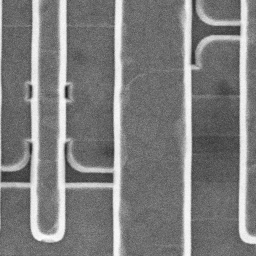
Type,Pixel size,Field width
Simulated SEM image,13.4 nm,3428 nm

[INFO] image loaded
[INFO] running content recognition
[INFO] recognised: wiring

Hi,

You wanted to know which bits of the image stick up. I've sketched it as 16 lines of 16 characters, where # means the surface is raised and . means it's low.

..##...#####...#
..##...#####...#
..##...#####...#
..##...#####...#
..##...#####...#
..##...#####...#
..##...#####...#
..##...#####...#
..##...#####...#
..##...#####...#
..##...#####...#
..##...#####...#
..##...#####...#
..##...#####...#
..##...#####...#
.......#####....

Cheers